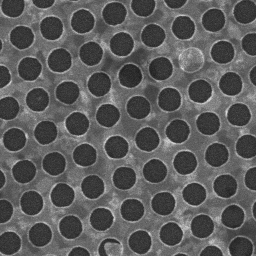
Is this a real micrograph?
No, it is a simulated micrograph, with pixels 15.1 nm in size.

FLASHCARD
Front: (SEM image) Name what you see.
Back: a regular array of holes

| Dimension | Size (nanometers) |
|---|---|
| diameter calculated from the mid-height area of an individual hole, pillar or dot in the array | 364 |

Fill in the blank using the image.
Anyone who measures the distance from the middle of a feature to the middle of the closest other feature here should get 475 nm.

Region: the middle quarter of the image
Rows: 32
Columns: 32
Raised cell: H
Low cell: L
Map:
LLHHHHLHHHHHHHHLLLHHHLLLLLLHHHHH
LHHHHHHHHHHHHHLLLLLHHLLLLLLHHHHH
HHHHHHHLLLLHHHLLLLLLHLLLLLLHHHHH
HHHHHHLLLLLHHHLLLLLLHHLLLLHHHHHH
LLHHHHLLLLLLHHLLLLLHHHHHHHHHHHHH
LLLLHHLLLLLLHHHLLLHHHHHHHHHHHHHL
LLLLHHLLLLLHHHHHHHHHHHHHLLLLHHHL
LLLLHHHLLLLHHHHHHHHHHHHHLLLLLHHL
LLLHHHHHHHHHHHHHHLLLHHHLLLLLLHHL
LLLHHHHHHHHHHHHHLLLLLHHLLLLLLHHH
HHHHHHHHHLLLLHHHLLLLLLHHLLLLLHHH
HHHHHHHHLLLLLLHHLLLLLLHHHLLLHHHH
HHLLLHHHLLLLLLHHLLLLLHHHHHHHHHHH
HLLLLLHHLLLLLLHHHLLLHHHHHHHHHHHH
LLLLLLHHLLLLLHHHHHHHHHHHHHHLLLHH
LLLLLLHHHHLLHHHHHHHHHHHHHHLLLLLH
HLLLLLHHHHHHHHHHHHHLLLLHHLLLLLLH
HHLLLHHHHHHHHHHHHHLLLLLLHLLLLLLH
HHHHHHHHHHHLLLLHHHLLLLLLHHLLLLLH
HHHHHHHHHHLLLLLLHHLLLLLLHHHLLLHH
HHHLLLLHHHLLLLLLHHLLLLLLHHHHHHHH
HHLLLLLLHHLLLLLLHHHHLLHHHHHHHHHH
HHLLLLLLHHHLLLLLHHHHHHHHHHHHLLLL
HHLLLLLLHHHHLLHHHHHHHHHHHHHHLLLL
LHHLLLLLHHHHHHHHHHHHHLLLLHHLLLLL
LHHHLLHHHHHHHHHHHHHHLLLLLLHLLLLL
HHHHHHHHHHHHHLLLLHHHLLLLLLHHLLLL
HHHHHHHHHHHHLLLLLLHHLLLLLLHHHLLH
HHHHHLLLLHHHLLLLLLHHLLLLLHHHHHHH
HHHHLLLLLLHHLLLLLLHHHLLLHHHHHHHH
LLHHLLLLLLHHHLLLLHHHHHHHHHHHHHLL
LLLHLLLLLLHHHHHHHHHHHHHHHHHHHHLL